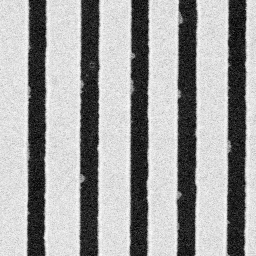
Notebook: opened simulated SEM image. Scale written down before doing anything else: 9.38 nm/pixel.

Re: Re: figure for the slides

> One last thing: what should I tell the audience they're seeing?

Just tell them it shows lines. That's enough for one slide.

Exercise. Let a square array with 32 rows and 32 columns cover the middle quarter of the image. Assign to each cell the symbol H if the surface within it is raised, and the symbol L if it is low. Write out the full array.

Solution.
HHHHLLLLLHHHHHHHHLLLLHHHHHHHLLLL
HHHHLLLLLHHHHHHHHLLLLHHHHHHHLLLL
HHHHLLLLLHHHHHHHHLLLLHHHHHHHLLLL
HHHHLLLLLHHHHHHHHLLLLHHHHHHHLLLL
HHHHLLLLLHHHHHHHHLLLLHHHHHHHLLLL
HHHHLLLLLHHHHHHHHLLLLHHHHHHHLLLL
HHHHLLLLLHHHHHHHHLLLLHHHHHHHLLLL
HHHHLLLLLHHHHHHHHLLLLHHHHHHHLLLL
HHHHLLLLLHHHHHHHHLLLLHHHHHHHLLLL
HHHHLLLLLHHHHHHHHLLLLHHHHHHHLLLL
HHHHLLLLLHHHHHHHHLLLLHHHHHHHLLLL
HHHHLLLLLHHHHHHHHLLLLHHHHHHHLLLL
HHHHLLLLLHHHHHHHHLLLLHHHHHHHLLLL
HHHHLLLLLHHHHHHHHLLLLHHHHHHHLLLL
HHHHLLLLLHHHHHHHHLLLLHHHHHHHLLLL
HHHHLLLLLHHHHHHHHLLLLHHHHHHHLLLL
HHHHLLLLLHHHHHHHHLLLLHHHHHHHLLLL
HHHHLLLLLHHHHHHHHLLLLHHHHHHHLLLL
HHHHLLLLLHHHHHHHHLLLLHHHHHHHLLLL
HHHHLLLLLHHHHHHHHLLLLHHHHHHHLLLL
HHHHLLLLLHHHHHHHHLLLLHHHHHHHLLLL
HHHHLLLLLHHHHHHHHLLLLHHHHHHHLLLL
HHHHLLLLLHHHHHHHHLLLLHHHHHHHLLLL
HHHHLLLLLHHHHHHHHLLLLHHHHHHHLLLL
HHHHLLLLLHHHHHHHHLLLLHHHHHHHLLLL
HHHHLLLLLHHHHHHHHLLLLHHHHHHHLLLL
HHHHLLLLLHHHHHHHLLLLLHHHHHHHLLLL
HHHHLLLLLHHHHHHHLLLLLHHHHHHHLLLL
HHHHLLLLLHHHHHHHLLLLLHHHHHHHLLLL
HHHHLLLLLHHHHHHHLLLLLHHHHHHHLLLL
HHHHLLLLLHHHHHHHHLLLLHHHHHHHLLLL
HHHHLLLLLHHHHHHHLLLLLHHHHHHHLLLL